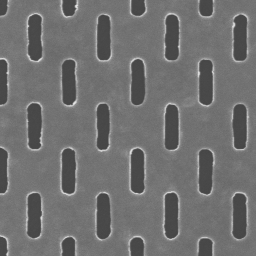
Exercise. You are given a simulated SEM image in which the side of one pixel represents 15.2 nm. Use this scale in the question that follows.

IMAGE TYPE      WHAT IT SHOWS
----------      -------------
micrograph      a regular array of holes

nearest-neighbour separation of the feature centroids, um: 0.849